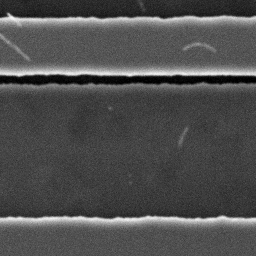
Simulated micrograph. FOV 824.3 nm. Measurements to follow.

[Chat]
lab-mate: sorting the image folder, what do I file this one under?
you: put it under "lines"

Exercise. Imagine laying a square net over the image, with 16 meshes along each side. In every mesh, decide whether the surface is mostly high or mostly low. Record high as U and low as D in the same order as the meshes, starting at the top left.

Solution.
DDDDDDDDDDDDDDDD
UUUUUUUUUUUUUUUU
UUUUUUUUUUUUUUUU
UUUUUUUUUUUUUUUU
UUUUUUUUUUUUUUUU
DDDDDDDDDDDDDDDD
DDDDDDDDDDDDDDDD
DDDDDDDDDDDDDDDD
DDDDDDDDDDDDDDDD
DDDDDDDDDDDDDDDD
DDDDDDDDDDDDDDDD
DDDDDDDDDDDDDDDD
DDDDDDDDDDDDDDDD
DDDDDDDDDDDDDDDD
UUUUUUUUUUUUUUUU
UUUUUUUUUUUUUUUU